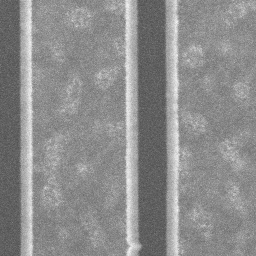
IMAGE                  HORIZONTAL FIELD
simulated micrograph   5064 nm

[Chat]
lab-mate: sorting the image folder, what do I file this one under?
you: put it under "one or a few lines or trenches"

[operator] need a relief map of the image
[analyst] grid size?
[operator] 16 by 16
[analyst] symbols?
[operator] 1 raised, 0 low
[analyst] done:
0011111100011111
0011111100011111
0011111100011111
0011111100011111
0011111100011111
0011111100011111
0011111100011111
0011111100011111
0011111100011111
0011111100011111
0011111100011111
0011111100011111
0011111100011111
0011111100011111
0011111100011111
0011111100011111